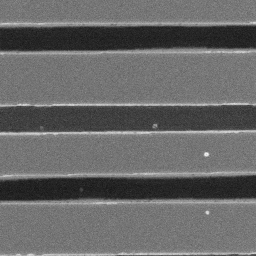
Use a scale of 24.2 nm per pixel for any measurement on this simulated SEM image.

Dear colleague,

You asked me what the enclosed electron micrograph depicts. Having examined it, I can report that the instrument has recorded lines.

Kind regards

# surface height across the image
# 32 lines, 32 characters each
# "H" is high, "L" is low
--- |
HHHHHHHHHHHHHHHHHHHHHHHHHHHHHHHH
HHHHHHHHHHHHHHHHHHHHHHHHHHHHHHHH
HHHHHHHHHHHHHHHHHHHHHHHHHHHHHHHH
LLLLLLLLLLLLLLLLLLLLLLLLLLLLLLLL
LLLLLLLLLLLLLLLLLLLLLLLLLLLLLLLL
LLLLLLLLLLLLLLLLLLLLLLLLLLLLLLLL
LLLLLLLLLLLLLLLLLLLLLLLLLHHHHHHH
HHHHHHHHHHHHHHHHHHHHHHHHHHHHHHHH
HHHHHHHHHHHHHHHHHHHHHHHHHHHHHHHH
HHHHHHHHHHHHHHHHHHHHHHHHHHHHHHHH
HHHHHHHHHHHHHHHHHHHHHHHHHHHHHHHH
HHHHHHHHHHHHHHHHHHHHHHHHHHHHHHHH
HHHHHHHHHHHHHHHHHHHHHHHHHHHHHHHH
LLLLLLLLLLLLLLLLLLLLLLLLLLLLLLLL
LLLLLLLLLLLLLLLLLLLLLLLLLLLLLLLL
LLLLLLLLLLLLLLLLLLLLLLLLLLLLLLLL
LLLLLLLLLLLLLLLLLLLLLLLHHHHHHHHH
HHHHHHHHHHHHHHHHHHHHHHHHHHHHHHHH
HHHHHHHHHHHHHHHHHHHHHHHHHHHHHHHH
HHHHHHHHHHHHHHHHHHHHHHHHHHHHHHHH
HHHHHHHHHHHHHHHHHHHHHHHHHHHHHHHH
HHHHHHHHHHHHHHHHHHHHHHHHHHHHHHHH
LLLLLLLLLLLLLLLLLLLLLLLLLLLLLLLL
LLLLLLLLLLLLLLLLLLLLLLLLLLLLLLLL
LLLLLLLLLLLLLLLLLLLLLLLLLLLLLLLL
HHHHHHHHHHHHHHHHHHHHHHHHHHHHHHHH
HHHHHHHHHHHHHHHHHHHHHHHHHHHHHHHH
HHHHHHHHHHHHHHHHHHHHHHHHHHHHHHHH
HHHHHHHHHHHHHHHHHHHHHHHHHHHHHHHH
HHHHHHHHHHHHHHHHHHHHHHHHHHHHHHHH
HHHHHHHHHHHHHHHHHHHHHHHHHHHHHHHH
HHHHHHHHHHHHHHHHHHHHHHHHHHHHHHHH